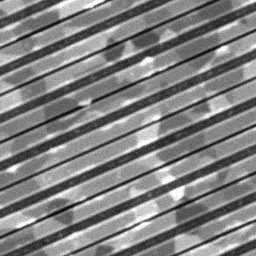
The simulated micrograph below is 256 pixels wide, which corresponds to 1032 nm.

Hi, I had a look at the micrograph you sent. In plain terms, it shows parallel lines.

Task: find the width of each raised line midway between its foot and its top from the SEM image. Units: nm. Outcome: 62.2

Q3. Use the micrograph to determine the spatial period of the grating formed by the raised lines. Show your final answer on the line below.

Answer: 87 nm